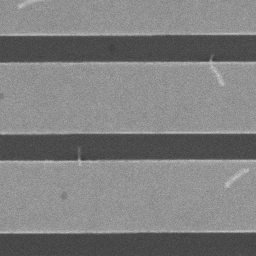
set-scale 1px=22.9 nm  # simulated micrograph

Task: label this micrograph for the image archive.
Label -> lines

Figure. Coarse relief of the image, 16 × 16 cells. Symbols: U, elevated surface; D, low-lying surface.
UUUUUUUUUUUUUUUU
UUUUUUUUUUUUUUUU
DDDDDDDDDDDDDDDD
DDDDDDDDDDDDDDDD
UUUUUUUUUUUUUUUU
UUUUUUUUUUUUUUUU
UUUUUUUUUUUUUUUU
UUUUUUUUUUUUUUUU
DDDDDDDDDDDDDDDD
DDDDDDDDDDDDDDDD
UUUUUUUUUUUUUUUU
UUUUUUUUUUUUUUUU
UUUUUUUUUUUUUUUU
UUUUUUUUUUUUUUUU
UUUUUUUUUDDDDDDD
DDDDDDDDDDDDDDDD